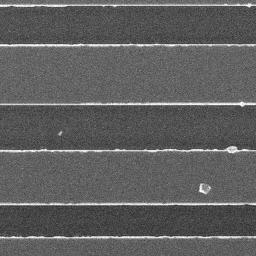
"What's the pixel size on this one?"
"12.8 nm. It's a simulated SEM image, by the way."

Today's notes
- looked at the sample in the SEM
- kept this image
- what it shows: lines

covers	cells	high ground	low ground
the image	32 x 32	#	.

################################
................................
................................
................................
................................
................................
################################
################################
################################
################################
################################
################################
################################
................................
................................
................................
................................
................................
................................
################################
################################
################################
################################
################################
################################
################################
................................
................................
................................
................................
################################
################################